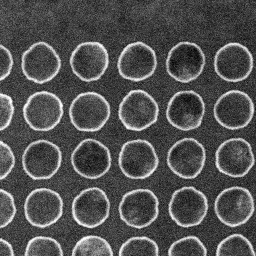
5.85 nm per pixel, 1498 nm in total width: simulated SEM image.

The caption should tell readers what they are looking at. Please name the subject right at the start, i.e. a regular array of raised bodies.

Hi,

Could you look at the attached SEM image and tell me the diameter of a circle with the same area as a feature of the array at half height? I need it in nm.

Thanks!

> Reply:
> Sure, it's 225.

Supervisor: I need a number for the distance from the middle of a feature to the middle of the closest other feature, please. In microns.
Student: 0.278